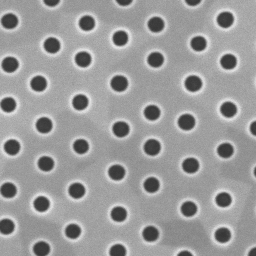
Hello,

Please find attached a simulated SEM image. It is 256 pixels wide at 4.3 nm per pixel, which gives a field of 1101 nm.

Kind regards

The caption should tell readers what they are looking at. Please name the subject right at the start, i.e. a regular array of holes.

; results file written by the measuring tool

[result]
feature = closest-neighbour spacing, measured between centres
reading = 158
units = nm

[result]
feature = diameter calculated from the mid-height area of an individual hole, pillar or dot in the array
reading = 0.0758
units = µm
